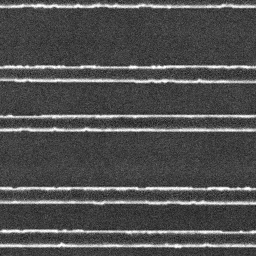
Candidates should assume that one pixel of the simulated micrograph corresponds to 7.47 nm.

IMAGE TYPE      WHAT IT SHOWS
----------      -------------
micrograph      lines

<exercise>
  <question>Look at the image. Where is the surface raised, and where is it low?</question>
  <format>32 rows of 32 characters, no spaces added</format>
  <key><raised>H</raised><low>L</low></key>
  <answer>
HHHHHHHHHHHHHHHHHHHHHHHHHHHHHHHH
LLLLLLLLLLLLLLLLLLLLLLLLLLLLLLLL
LLLLLLLLLLLLLLLLLLLLLLLLLLLLLLLL
LLLLLLLLLLLLLLLLLLLLLLLLLLLLLLLL
LLLLLLLLLLLLLLLLLLLLLLLLLLLLLLLL
LLLLLLLLLLLLLLLLLLLLLLLLLLLLLLLL
LLLLLLLLLLLLLLLLLLLLLLLLLLLLLLLL
LLLLLLLLLLLLLLLLLLLLLLLLLLLLLLLL
HHHHHHHHHHHHHHHHHHHHHHHHHHHHHHHH
HHHHHHHHHHHHHHHHHHHHHHHHHHHHHHHH
LLLLLLLLLLLLLLLLLLLLLLLLLLLLLLLL
LLLLLLLLLLLLLLLLLLLLLLLLLLLLLLLL
LLLLLLLLLLLLLLLLLLLLLLLLLLLLLLLL
LLLLLLLLLLLLLLLLLLLLLLLLLLLLLLLL
LHLLLHHHHHHHHHHHHHHHHHHHHHHHHHHH
HHHHHHHHHHHHHHHHHHHHHHHHHHHHHHHH
LLLLLLLLLLLLLLLLLLLLLLLLLLLLLLLL
LLLLLLLLLLLLLLLLLLLLLLLLLLLLLLLL
LLLLLLLLLLLLLLLLLLLLLLLLLLLLLLLL
LLLLLLLLLLLLLLLLLLLLLLLLLLLLLLLL
LLLLLLLLLLLLLLLLLLLLLLLLLLLLLLLL
LLLLLLLLLLLLLLLLLLLLLLLLLLLLLLLL
LLLLLLLLLLLLLLLLLLLLLLLLLLLLLLLL
HHHHHHHHHHHHHHHHHHHHHHHHLLHHHHHH
HHHHHHHHHHHHHHHHHHHHHHHHHHHHHHHH
LLLLLLLLLLLLLLLLLLLLLLLLLLLLLLLL
LLLLLLLLLLLLLLLLLLLLLLLLLLLLLLLL
LLLLLLLLLLLLLLLLLLLLLLLLLLLLLLLL
LLLLLLLLLLLLLLLLLLLLLLLLLLLLLLLL
HHHHHHHHHHHHHHHHHHHHHHHHHHHHHHHH
HHHHHHHHHHHHHHHHHHHHHHHHHHHHHHHH
LLLLLLLLLLLLLLLLLLLLLLLLLLLLLLLL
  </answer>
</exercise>